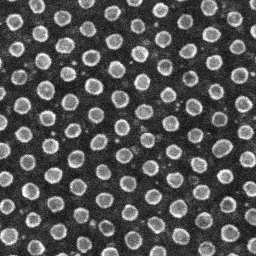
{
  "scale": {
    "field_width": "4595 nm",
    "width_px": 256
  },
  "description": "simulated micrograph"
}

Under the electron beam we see a regular array of raised bodies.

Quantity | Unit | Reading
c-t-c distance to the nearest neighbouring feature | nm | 493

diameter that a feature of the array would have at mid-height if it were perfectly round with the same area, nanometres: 262